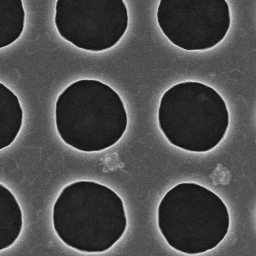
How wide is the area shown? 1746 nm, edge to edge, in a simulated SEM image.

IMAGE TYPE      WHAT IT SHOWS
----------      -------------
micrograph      holes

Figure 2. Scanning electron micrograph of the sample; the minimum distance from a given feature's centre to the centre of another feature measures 0.692 microns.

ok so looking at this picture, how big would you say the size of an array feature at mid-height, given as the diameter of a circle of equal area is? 0.483 µm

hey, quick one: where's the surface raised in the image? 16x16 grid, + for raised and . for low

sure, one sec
.+++....++....++
.+++....++....++
.+++...++++...++
++++++++++++++++
++++++++++++++++
++++...++++..+++
.+++....++....++
.+++....++....++
.+++....++....++
++++++++++++++++
++++++++++++++++
++++..+++++.++++
.+++....++....++
.++.....++....++
.+++....++....++
+++++..++++..+++